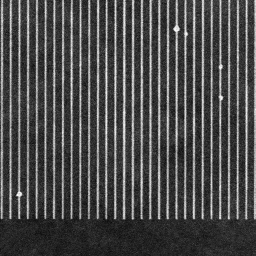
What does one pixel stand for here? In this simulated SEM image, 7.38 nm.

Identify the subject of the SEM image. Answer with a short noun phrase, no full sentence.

parallel lines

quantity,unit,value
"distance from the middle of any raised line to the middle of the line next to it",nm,64.5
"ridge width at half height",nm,10.1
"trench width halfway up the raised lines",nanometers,54.4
